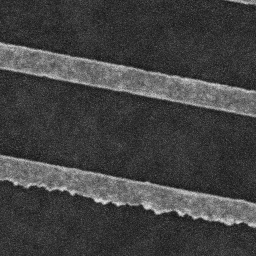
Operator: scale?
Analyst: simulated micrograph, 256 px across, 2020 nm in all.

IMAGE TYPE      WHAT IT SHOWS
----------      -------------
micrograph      one or a few lines or trenches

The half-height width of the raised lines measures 187 nanometres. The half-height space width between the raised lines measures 678 nm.